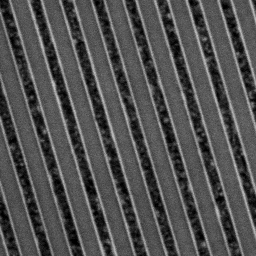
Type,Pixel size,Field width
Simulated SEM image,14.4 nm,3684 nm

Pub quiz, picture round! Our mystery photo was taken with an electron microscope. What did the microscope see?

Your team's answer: parallel lines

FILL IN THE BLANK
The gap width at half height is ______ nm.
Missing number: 245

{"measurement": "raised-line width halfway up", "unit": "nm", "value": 192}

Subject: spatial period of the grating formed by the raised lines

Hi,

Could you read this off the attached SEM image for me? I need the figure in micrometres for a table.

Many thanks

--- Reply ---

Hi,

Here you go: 0.437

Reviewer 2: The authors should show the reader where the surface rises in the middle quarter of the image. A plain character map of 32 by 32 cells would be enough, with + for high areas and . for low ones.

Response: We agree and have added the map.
....+++.....+++.....+++....++++.
....++++....+++.....+++.....+++.
....++++....++++....+++.....++++
.....+++.....+++....++++....++++
.....+++.....+++.....+++.....+++
+....++++....+++.....+++.....+++
+.....+++....++++....++++....+++
+.....+++.....+++.....+++.....++
+.....++++....+++.....+++.....++
++....++++....++++....+++.....++
++.....+++.....+++.....+++....++
+++....+++.....+++.....+++.....+
+++....++++....+++.....+++.....+
+++.....+++.....+++....++++....+
+++.....+++.....+++.....+++.....
++++....++++....+++.....+++.....
.+++....++++....++++....++++....
.+++.....+++.....+++.....+++....
.++++....++++....+++.....+++....
.++++....++++....+++.....+++....
..+++.....+++.....+++....++++...
..+++.....+++.....+++.....+++...
..++++....++++....+++.....+++...
...+++.....+++....++++....++++..
...+++.....+++.....+++.....+++..
...+++.....++++....+++.....+++..
....+++....++++....++++....+++..
....+++.....+++.....+++.....+++.
....+++.....+++.....+++.....+++.
....++++....++++....+++.....+++.
.....+++.....+++....++++....++++
.....+++.....+++.....+++.....+++